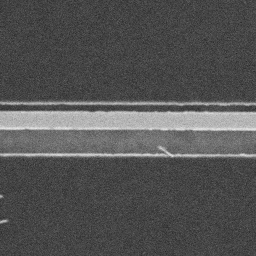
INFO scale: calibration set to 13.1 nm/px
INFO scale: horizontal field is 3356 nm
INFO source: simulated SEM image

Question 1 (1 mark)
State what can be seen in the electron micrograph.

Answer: lines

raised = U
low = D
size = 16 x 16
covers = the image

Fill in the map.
UUUUUUUUUUUUUUUU
UUUUUUUUUUUUUUUU
UUUUUUUUUUUUUUUU
UUUUUUUUUUUUUUUU
UUUUUUUUUUUUUUUU
UUUUUUUUUUUUUUUU
UUUUUUUUUUUUUUUU
UUUUUUUUUUUUUUUU
DDDDDDDDDDDDDDDD
DDDDDDDDDDDDDDDD
UUUUUUUUUUUUUUUU
UUUUUUUUUUUUUUUU
UUUUUUUUUUUUUUUU
UUUUUUUUUUUUUUUU
UUUUUUUUUUUUUUUU
UUUUUUUUUUUUUUUU